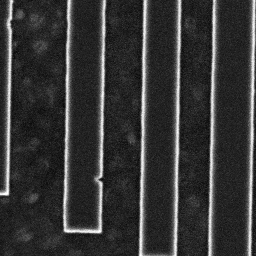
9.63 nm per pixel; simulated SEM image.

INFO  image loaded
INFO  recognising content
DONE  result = one or a few lines or trenches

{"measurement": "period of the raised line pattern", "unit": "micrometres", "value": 0.709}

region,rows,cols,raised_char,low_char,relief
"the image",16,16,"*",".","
*...**...**..***
*...**...**..***
*...**...**..***
*...**...**..***
*...**...**..***
*...**...**..***
*...**...**..***
*...**...**..***
*...**...**..***
*...**...**..***
....**...**..***
....**...**..***
....**...**..***
....**...**..***
.....*...**..***
.........**..***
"